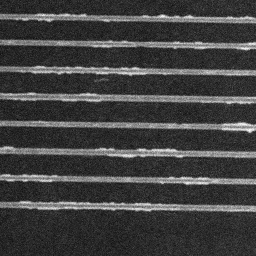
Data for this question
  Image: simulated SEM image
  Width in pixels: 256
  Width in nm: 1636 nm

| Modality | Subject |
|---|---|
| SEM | parallel lines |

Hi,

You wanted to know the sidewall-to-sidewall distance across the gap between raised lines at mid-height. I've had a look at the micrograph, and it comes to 21.7 px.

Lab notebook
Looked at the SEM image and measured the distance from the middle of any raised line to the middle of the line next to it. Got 172 nanometers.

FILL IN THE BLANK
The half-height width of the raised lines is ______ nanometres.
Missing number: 37.5